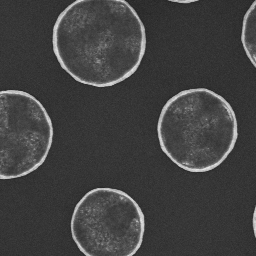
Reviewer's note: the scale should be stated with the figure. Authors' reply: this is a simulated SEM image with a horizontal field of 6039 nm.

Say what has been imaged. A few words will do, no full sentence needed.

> raised bodies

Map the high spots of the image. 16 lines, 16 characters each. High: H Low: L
LLLLHHHHLLLLLLLL
LLLLHHHHHLLLLLLH
LLLHHHHHHLLLLLLH
LLLLHHHHHLLLLLLL
LLLLHHHHLLLLLLLL
LLLLLLLLLLLLLLLL
HHLLLLLLLLLHHHLL
HHHLLLLLLLHHHHHL
HHHLLLLLLLHHHHHL
HHHLLLLLLLHHHHLL
HHLLLLLLLLLLHLLL
LLLLLLLLLLLLLLLL
LLLLLHHHLLLLLLLL
LLLLLHHHHLLLLLLL
LLLLLHHHHLLLLLLL
LLLLLHHHHLLLLLLL